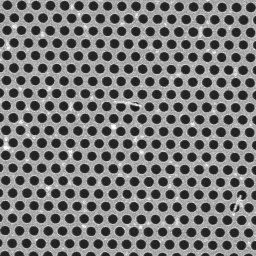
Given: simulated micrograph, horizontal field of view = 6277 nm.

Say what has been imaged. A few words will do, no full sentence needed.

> a regular array of holes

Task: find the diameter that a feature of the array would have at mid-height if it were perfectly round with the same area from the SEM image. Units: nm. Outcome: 240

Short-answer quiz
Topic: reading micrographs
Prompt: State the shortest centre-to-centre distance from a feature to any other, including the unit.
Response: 348 nanometers